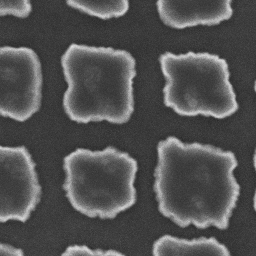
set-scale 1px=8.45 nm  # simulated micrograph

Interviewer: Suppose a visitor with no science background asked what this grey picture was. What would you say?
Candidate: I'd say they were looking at raised bodies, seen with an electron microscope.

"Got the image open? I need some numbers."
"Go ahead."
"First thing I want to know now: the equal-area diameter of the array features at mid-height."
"0.616 microns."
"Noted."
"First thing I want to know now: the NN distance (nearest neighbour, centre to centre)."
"0.815 um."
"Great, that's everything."